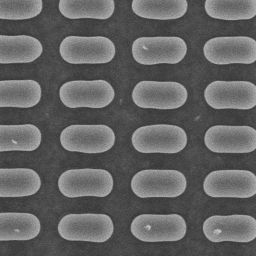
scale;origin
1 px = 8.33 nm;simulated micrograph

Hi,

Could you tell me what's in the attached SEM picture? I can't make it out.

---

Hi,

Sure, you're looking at groups of lines, slits or small figures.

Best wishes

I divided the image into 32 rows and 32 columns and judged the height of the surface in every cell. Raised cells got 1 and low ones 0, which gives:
11111001111111000111111000111111
11111000111111000111111000111111
00000000000000000000000000000000
00000000000000000000000000000000
10100000000000000000000000000000
11111000111111000111111000111111
11111000111111000111111000111111
11110000111111000111111000111111
00000000000000000000000000000000
00000000000000000000000000000000
11111000111111000111110000111111
11111000111111000111111000111111
11111000111111000111111000111111
00000000000000000001110000011110
00000000000000000000000000000000
00000000000000000000000000000000
11111000111111000111111000111111
11111000111111000111111000111111
11110000111111000111111000111111
00000000000000000000000000000000
00000000000000000000000000000000
11110000111110000111110000011110
11111001111111000111111000111111
11111001111111000111111001111111
00000000110010000111110000111110
00000000000000000000000000000000
00000000000000000000000000000000
11111000111111000111111000111111
11111001111111001111111001111111
11110000111111000111111000111111
00000000000000000000000000000000
00000000000000000000000000000000